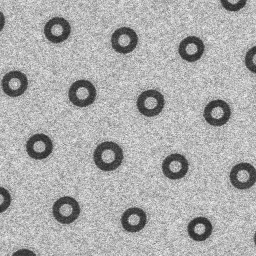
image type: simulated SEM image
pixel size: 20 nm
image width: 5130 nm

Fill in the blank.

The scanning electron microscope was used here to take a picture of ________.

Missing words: a regular array of ring-shaped grooves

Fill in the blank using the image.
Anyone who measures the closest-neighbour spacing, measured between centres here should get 1350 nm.